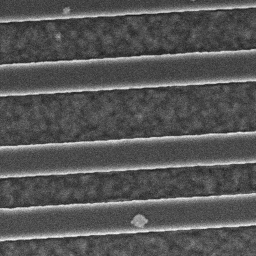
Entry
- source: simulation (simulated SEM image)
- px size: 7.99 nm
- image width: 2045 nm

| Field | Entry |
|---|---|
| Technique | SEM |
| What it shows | lines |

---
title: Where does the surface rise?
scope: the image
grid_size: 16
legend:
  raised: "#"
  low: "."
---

###############.
................
................
.........#######
################
########........
................
................
...........#####
################
##########......
................
.........#######
################
#########.......
................